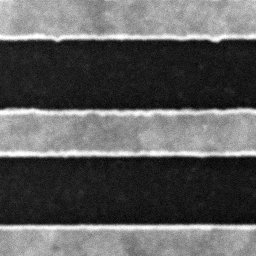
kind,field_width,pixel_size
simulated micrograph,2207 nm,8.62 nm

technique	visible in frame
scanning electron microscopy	one or a few lines or trenches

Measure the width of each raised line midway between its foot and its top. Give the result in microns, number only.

0.364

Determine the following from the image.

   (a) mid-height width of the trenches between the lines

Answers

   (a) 73.3 px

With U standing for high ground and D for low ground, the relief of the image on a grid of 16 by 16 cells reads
UUUUUUUUUUUUUUUU
UUUUUUUUUUUUUUUU
DDDDDDDDDDDDDDDD
DDDDDDDDDDDDDDDD
DDDDDDDDDDDDDDDD
DDDDDDDDDDDDDDDD
DDDDDDDDDDDDDDDD
UUUUUUUUUUUUUUUU
UUUUUUUUUUUUUUUU
UUUUUUUUUUUUUUUU
DDDDDDDDDDDDDDDD
DDDDDDDDDDDDDDDD
DDDDDDDDDDDDDDDD
DDDDDDDDDDDDDDDD
UUUUUUUUUUUUUUUU
UUUUUUUUUUUUUUUU